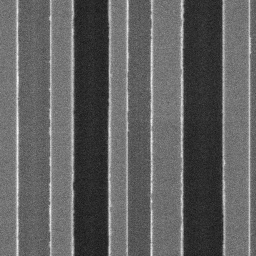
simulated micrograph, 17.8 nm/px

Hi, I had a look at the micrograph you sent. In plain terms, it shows lines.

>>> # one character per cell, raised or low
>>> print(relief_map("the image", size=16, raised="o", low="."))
ooooo..oooo...oo
ooooo..oooo...oo
ooooo..oooo...oo
ooooo..oooo...oo
ooooo..oooo...oo
ooooo..oooo...oo
ooooo..oooo...oo
ooooo..oooo...oo
ooooo..oooo...oo
ooooo..oooo...oo
ooooo..oooo...oo
ooooo..oooo...oo
ooooo..oooo...oo
ooooo..oooo...oo
ooooo..oooo...oo
ooooo..oooo...oo